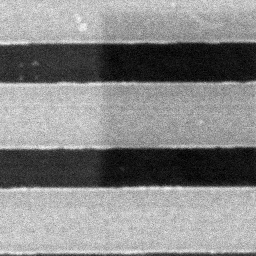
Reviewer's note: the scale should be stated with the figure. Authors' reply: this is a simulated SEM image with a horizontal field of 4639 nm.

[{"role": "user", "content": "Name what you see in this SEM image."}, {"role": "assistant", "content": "lines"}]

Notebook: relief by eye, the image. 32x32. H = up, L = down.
HHHHHHHHHHHHHHHHHHHHHHHHHHHHHHHH
HHHHHHHHHHHHHHHHHHHHHHHHHHHHHHHH
HHHHHHHHHHHHHHHHHHHHHHHHHHHHHHHH
HHHHHHHHHHHHHHHHHHHHHHHHHHHHHHHH
HHHHHHHHHHHHHHHHHHHHHHHHHHHHHHHH
LLLLLLLLLLLLLLLLLLLLLLLLLLLLLLLL
LLLLLLLLLLLLLLLLLLLLLLLLLLLLLLLL
LLLLLLLLLLLLLLLLLLLLLLLLLLLLLLLL
LLLLLLLLLLLLLLLLLLLLLLLLLLLLLLLL
LLLLLLLLLLLLLLLLLLLLLLLLLLLLLLLL
LLLLLLLLLLLLHHHHHHHHHHHHHHHHHHHH
HHHHHHHHHHHHHHHHHHHHHHHHHHHHHHHH
HHHHHHHHHHHHHHHHHHHHHHHHHHHHHHHH
HHHHHHHHHHHHHHHHHHHHHHHHHHHHHHHH
HHHHHHHHHHHHHHHHHHHHHHHHHHHHHHHH
HHHHHHHHHHHHHHHHHHHHHHHHHHHHHHHH
HHHHHHHHHHHHHHHHHHHHHHHHHHHHHHHH
HHHHHHHHHHHHHHHHHHHHHHHHHHHHHHHH
LLLLLLLLLLLLLLLLLLLLLLLLLLLLLLLL
LLLLLLLLLLLLLLLLLLLLLLLLLLLLLLLL
LLLLLLLLLLLLLLLLLLLLLLLLLLLLLLLL
LLLLLLLLLLLLLLLLLLLLLLLLLLLLLLLL
LLLLLLLLLLLLLLLLLLLLLLLLLLLLLLLL
LLLLLLLLLLLLLLLLLLLLLLLLLLLLLLLL
HHHHHHHHHHHHHHHHHHHHHHHHHHHHHHHH
HHHHHHHHHHHHHHHHHHHHHHHHHHHHHHHH
HHHHHHHHHHHHHHHHHHHHHHHHHHHHHHHH
HHHHHHHHHHHHHHHHHHHHHHHHHHHHHHHH
HHHHHHHHHHHHHHHHHHHHHHHHHHHHHHHH
HHHHHHHHHHHHHHHHHHHHHHHHHHHHHHHH
HHHHHHHHHHHHHHHHHHHHHHHHHHHHHHHH
HHHHHHHHHHHHHHHHHHHLLLLLLLHLLLLL